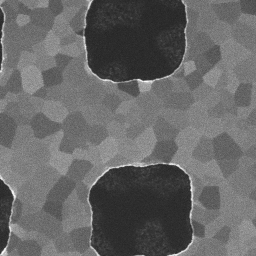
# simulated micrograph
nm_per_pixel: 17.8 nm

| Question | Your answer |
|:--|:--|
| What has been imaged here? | holes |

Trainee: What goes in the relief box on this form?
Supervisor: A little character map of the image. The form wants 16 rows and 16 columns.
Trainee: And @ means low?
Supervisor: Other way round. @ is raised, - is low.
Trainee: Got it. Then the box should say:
@@@@@@------@@@@
@@@@@-------@@@@
@@@@@-------@@@@
@@@@@------@@@@@
@@@@@@-----@@@@@
@@@@@@@@@@@@@@@@
@@@@@@@@@@@@@@@@
@@@@@@@@@@@@@@@@
@@@@@@@@@@@@@@@@
@@@@@@@@@@@@@@@@
@@@@@@@----@@@@@
@@@@@@------@@@@
-@@@@@------@@@@
-@@@@@------@@@@
-@@@@@------@@@@
@@@@@@------@@@@